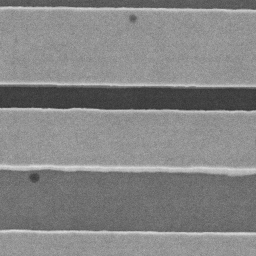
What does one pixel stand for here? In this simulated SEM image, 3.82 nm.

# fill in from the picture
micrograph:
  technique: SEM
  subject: lines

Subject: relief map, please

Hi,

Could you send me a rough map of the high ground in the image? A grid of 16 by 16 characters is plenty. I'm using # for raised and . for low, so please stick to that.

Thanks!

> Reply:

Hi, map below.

######.#........
################
################
################
################
................
................
################
################
################
......#.########
................
................
................
##########......
################